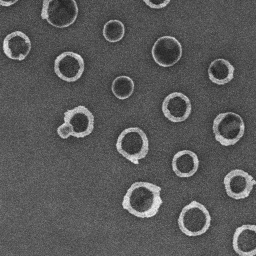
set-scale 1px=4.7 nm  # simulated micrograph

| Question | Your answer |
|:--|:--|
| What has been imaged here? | a regular array of raised bodies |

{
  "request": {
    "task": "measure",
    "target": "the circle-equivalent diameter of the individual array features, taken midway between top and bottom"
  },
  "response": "136 nm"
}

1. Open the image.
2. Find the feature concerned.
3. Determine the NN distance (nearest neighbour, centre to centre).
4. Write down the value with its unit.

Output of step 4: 264 nanometres